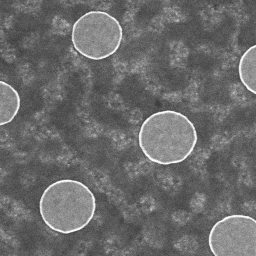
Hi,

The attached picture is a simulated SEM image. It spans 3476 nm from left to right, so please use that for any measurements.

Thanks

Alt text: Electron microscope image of raised bodies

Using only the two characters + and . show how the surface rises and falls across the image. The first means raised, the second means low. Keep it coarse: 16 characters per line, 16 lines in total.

................
.....++.........
.....++.........
.....++........+
...............+
+...............
+...............
+........+++....
.........+++....
.........+++....
................
...++...........
...+++..........
...+++..........
.............+++
.............+++